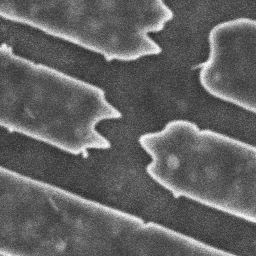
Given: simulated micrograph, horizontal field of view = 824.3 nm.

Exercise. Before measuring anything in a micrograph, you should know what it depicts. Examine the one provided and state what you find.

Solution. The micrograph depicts one or a few lines or trenches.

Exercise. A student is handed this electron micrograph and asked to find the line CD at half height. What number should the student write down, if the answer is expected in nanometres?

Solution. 221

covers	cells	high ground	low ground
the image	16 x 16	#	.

##########......
..########....##
....#####....###
#......##....###
####.........###
######.......###
#######........#
######..........
..####...#####..
.........#######
.........#######
###.......######
#####.......####
########.......#
###########.....
#############...